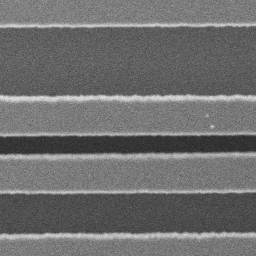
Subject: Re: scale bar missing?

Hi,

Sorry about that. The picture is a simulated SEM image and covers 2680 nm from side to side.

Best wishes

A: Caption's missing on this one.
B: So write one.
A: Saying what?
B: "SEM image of lines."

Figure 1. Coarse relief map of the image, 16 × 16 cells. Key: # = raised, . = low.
################
################
................
................
................
................
################
################
#...............
................
################
################
................
................
................
################